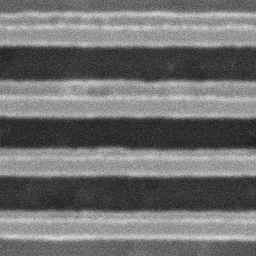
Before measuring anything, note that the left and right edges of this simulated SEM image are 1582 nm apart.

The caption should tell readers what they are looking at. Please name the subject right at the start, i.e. lines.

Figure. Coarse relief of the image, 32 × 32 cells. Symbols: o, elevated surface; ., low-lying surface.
................................
................................
oooooooooooooooooooooooooooooooo
oooooooooooooooooooooooooooooooo
oooooooooooooooooooooooooooooooo
oooooooooooooooooooooooooooooooo
................................
................................
................................
................................
oooooooooooooooooo...ooooooooooo
oooooooooooooooooooooooooooooooo
oooooooooooooooooooooooooooooooo
oooooooooooooooooooooooooooooooo
...o.....ooo.oo..oo.ooooo.oooooo
................................
................................
................................
................................
oooooooooooooooooooooooooooooooo
oooooooooooooooooooooooooooooooo
oooooooooooooooooooooooooooooooo
................................
................................
................................
................................
................................
oooooooooooooooooooooooooooooooo
oooooooooooooooooooooooooooooooo
oooooooooooooooooooooooooooooooo
................................
................................